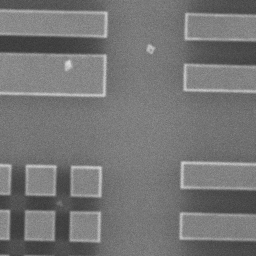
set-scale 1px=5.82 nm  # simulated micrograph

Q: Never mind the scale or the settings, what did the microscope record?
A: groups of lines, slits or small figures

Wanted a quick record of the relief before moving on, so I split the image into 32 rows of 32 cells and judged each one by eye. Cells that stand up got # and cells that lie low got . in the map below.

................................
##########......................
#############..........#########
#############..........#########
..........###..........#########
................................
................................
#############...................
#############..........#########
#############..........#########
#############..........#########
#############...................
................................
................................
................................
................................
................................
................................
................................
................................
.......................########.
#..####..####..........#########
#..####..####..........#########
#..####..####..............#####
................................
................................
#..####.........................
#..####..###...........#########
#..####..###...........#########
#..####..###...........#########
................................
................................